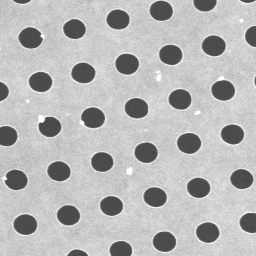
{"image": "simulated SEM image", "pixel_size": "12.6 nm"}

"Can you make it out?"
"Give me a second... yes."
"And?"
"a regular array of holes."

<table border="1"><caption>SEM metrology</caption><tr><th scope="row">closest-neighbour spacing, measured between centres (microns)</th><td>0.553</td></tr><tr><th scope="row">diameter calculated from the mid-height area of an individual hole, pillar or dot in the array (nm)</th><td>267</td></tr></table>